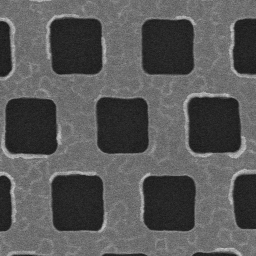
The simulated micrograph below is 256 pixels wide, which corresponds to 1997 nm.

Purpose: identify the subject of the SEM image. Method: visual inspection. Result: holes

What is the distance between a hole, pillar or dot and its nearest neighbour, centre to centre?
701 nanometers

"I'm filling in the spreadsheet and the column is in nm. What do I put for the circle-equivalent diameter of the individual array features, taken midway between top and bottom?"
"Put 463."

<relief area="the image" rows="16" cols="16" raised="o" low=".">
oooooooooooooooo
ooo...ooo...ooo.
.oo...ooo...ooo.
.oo...ooo...ooo.
.ooo..ooo...ooo.
oooooooooooooooo
o..ooo...ooo...o
....oo...ooo...o
....oo...ooo...o
o..oooo..ooo..oo
oooooooooooooooo
.oo...ooo...ooo.
.oo...ooo...ooo.
.oo...ooo...ooo.
oooooooooooooooo
oooooooooooooooo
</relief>